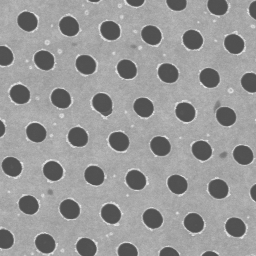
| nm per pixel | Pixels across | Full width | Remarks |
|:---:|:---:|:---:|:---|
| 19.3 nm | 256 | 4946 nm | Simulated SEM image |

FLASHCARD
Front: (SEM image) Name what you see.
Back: a regular array of holes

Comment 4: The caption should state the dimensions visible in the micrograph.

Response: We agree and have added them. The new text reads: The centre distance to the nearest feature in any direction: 800 nm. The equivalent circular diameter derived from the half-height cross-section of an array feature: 375 nanometers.